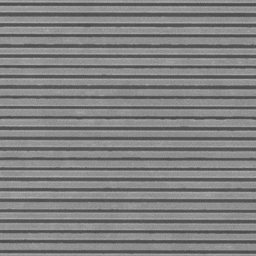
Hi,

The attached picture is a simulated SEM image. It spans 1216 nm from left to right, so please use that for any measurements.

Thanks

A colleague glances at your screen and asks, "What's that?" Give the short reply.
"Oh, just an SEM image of parallel lines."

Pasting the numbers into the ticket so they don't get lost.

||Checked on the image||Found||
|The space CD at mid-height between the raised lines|20.8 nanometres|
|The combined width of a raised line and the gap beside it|0.0491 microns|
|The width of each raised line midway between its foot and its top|6.25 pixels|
